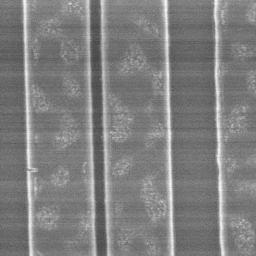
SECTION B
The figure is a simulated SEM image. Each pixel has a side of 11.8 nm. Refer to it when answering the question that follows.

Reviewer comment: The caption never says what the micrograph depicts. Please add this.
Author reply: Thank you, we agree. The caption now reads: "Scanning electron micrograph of one or a few lines or trenches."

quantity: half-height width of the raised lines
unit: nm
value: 761